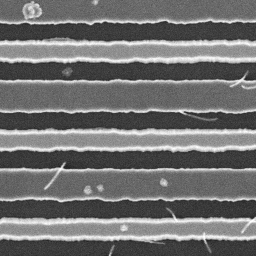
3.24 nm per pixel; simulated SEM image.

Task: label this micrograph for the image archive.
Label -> lines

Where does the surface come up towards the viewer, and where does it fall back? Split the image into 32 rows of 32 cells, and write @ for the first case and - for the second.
@@@@@@@@@@@@@@@@@@@@@@@@@@@@@@@@
@@@@@@@@@@@@@@@@@@@@@@@@@@@@@@@@
@@@@@@@@@@@@@@@@@@@@@@@@@@@@@@@@
--------------------------------
--------------------------------
@@@@@@@@@@@@@@@@@@@@@@@@@@@@@@@@
@@@@@@@@@@@@@@@@@@@@@@@@@@@@@@@@
@@@@@@@@@@@@@@@@@@@@@@@@@@@@@@@@
--------------------------------
--------------------------------
@@@@@@@@@@@@@@@@@@@@@@@@@@@@@@@@
@@@@@@@@@@@@@@@@@@@@@@@@@@@@@@@@
@@@@@@@@@@@@@@@@@@@@@@@@@@@@@@@@
@@@@@@@@@@@@@@@@@@@@@@@@@@@@@@@@
--------------------------------
--------------------------------
@@@@@@@@@@@@@@@@@@@@@@@@@@@@@@@@
@@@@@@@@@@@@@@@@@@@@@@@@@@@@@@@@
@@@@@@@@@@@@@@@@@@@@@@@@@@@@@@@@
--------------------------------
--------------------------------
@@@@@@@@@@@@@@@@@@@@@@@@@@@@@@@@
@@@@@@@@@@@@@@@@@@@@@@@@@@@@@@@@
@@@@@@@@@@@@@@@@@@@@@@@@@@@@@@@@
@@@@@@@@@@@@@@@@@@@@@@@@@@@@@@@@
--------------------------------
--------------------------------
@-------@@@@--@@@@--@@@@@@@@@@@@
@@@@@@@@@@@@@@@@@@@@@@@@@@@@@@@@
@@@@@@@@@@@@@@@@@@@@@@@@@@@@@@@@
--------------------------------
--------------------------------